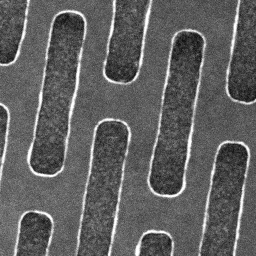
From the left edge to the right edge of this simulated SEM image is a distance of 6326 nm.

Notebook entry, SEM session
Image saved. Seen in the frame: holes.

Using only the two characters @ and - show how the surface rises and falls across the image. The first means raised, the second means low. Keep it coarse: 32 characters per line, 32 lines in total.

---@@@@@@@@@@@-----@@@@@@@@@@@--
---@@@@@@@@@@@----@@@@@@@@@@@@--
---@@@@---@@@@----@@@@@@@@@@@@--
---@@@@----@@@----@@@@@@@@@@@---
---@@@----@@@@----@@@@---@@@@---
--@@@@----@@@@----@@@@----@@@---
--@@@@----@@@@----@@@----@@@@---
--@@@@----@@@-----@@@----@@@@---
@@@@@@----@@@----@@@@----@@@@---
@@@@@@----@@@----@@@@----@@@----
@@@@@-----@@@@@@@@@@@----@@@----
@@@@@----@@@@@@@@@@@@----@@@@---
@@@@@----@@@@@@@@@@@----@@@@@@--
-@@@@----@@@@@@@@@@@----@@@@@@@@
-@@@@----@@@@@@@@@@@----@@@@@@@@
-@@@@----@@@----@@@@----@@@@@@@@
-@@@-----@@@----@@@@----@@@@@@@@
-@@@----@@@@----@@@@----@@@@@@@@
-@@@----@@@@----@@@-----@@@----@
@@@@----@@@@----@@@----@@@@----@
@@@@----@@@----@@@@----@@@@----@
@@@@---@@@@----@@@@----@@@@----@
@@@@@@@@@@@----@@@@----@@@-----@
@@@@@@@@@@@----@@@@----@@@----@@
@@@@@@@@@@@----@@@@@@@@@@@----@@
@@@@@@@@@@-----@@@@@@@@@@@----@@
@@@@@@@@@@-----@@@@@@@@@@@----@@
@@@---@@@@----@@@@@@@@@@@@----@@
@@-----@@@----@@@@@@@@@@@@----@@
@@----@@@@----@@@@---@@@@-----@@
@@----@@@@----@@@-----@@@----@@@
@@----@@@@----@@@----@@@@----@@@